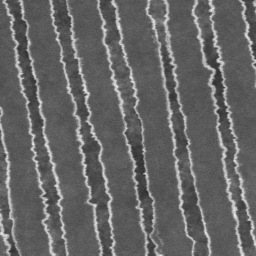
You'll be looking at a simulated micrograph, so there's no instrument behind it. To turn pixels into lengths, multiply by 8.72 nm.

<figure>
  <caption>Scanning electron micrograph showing parallel lines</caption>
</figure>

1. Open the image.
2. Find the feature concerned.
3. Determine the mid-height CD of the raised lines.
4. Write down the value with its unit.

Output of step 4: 285 nm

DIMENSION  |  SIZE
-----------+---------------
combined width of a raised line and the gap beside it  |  0.404 micrometres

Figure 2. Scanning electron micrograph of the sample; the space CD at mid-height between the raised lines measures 114 nanometers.